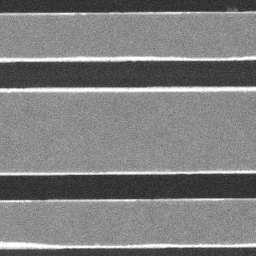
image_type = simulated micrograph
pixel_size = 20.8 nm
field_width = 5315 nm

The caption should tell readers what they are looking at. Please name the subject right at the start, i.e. lines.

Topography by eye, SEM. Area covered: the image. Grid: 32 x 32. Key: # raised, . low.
................................
................................
################################
################################
################################
################################
################################
############################....
................................
................................
................................
################################
################################
################################
################################
################################
################################
################################
################################
################################
################################
################################
................................
................................
................................
################################
################################
################################
################################
################################
################################
................................